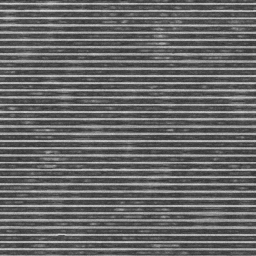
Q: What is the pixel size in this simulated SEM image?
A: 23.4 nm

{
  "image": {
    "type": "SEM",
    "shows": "parallel lines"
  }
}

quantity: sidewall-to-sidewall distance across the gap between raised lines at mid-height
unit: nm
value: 138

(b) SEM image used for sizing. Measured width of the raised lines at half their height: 32.2 nanometres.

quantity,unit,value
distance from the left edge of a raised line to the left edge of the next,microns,0.169